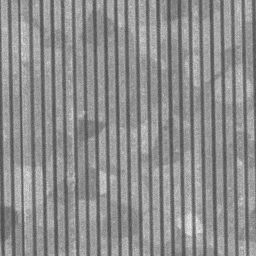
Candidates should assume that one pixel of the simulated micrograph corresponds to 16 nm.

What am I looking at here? parallel lines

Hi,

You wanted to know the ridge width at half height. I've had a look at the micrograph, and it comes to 98 nm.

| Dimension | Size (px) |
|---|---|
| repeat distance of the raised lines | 10.6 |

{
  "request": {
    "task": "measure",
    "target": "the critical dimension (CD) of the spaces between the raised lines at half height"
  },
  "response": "0.07 micrometres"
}